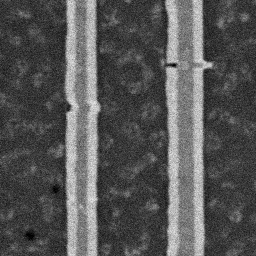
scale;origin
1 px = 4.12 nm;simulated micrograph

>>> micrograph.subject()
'one or a few lines or trenches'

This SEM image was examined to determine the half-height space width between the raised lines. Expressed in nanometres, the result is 331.